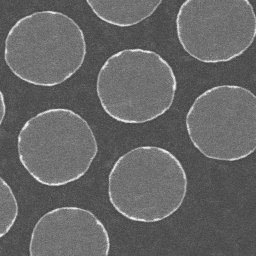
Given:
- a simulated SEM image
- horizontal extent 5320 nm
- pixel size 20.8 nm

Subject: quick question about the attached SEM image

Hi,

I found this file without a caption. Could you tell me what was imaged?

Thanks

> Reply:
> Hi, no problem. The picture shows raised bodies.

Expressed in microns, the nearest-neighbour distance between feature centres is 2.04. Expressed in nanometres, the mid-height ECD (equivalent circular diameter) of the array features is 1590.